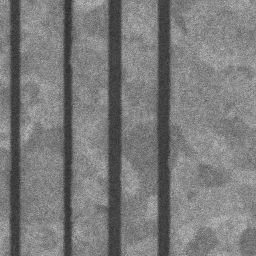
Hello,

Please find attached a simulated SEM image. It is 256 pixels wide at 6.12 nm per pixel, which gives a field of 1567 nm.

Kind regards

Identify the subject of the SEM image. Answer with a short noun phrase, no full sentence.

parallel lines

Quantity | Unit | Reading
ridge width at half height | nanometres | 219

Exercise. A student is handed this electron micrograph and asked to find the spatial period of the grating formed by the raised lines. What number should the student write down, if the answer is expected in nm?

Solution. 297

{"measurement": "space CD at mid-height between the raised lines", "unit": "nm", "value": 71.5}